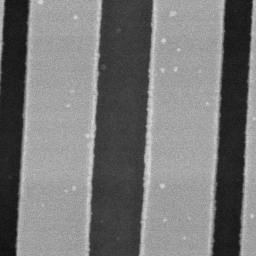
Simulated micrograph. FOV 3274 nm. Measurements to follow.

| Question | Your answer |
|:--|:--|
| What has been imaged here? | lines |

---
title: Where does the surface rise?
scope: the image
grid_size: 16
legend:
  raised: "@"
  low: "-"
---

--@@@@----@@@@--
--@@@@----@@@@--
--@@@@----@@@@--
--@@@@---@@@@@--
--@@@@---@@@@@--
--@@@@---@@@@@--
--@@@@---@@@@@-@
--@@@@---@@@@@-@
-@@@@@---@@@@@-@
-@@@@@---@@@@@-@
-@@@@@---@@@@--@
-@@@@@---@@@@--@
-@@@@@---@@@@--@
-@@@@@---@@@@--@
-@@@@@---@@@@--@
-@@@@----@@@@--@